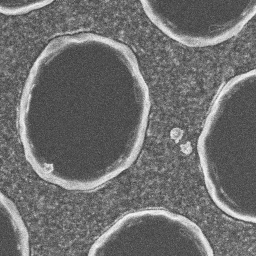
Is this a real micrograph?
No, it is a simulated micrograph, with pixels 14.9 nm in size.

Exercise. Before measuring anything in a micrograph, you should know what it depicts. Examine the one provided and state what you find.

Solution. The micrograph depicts raised bodies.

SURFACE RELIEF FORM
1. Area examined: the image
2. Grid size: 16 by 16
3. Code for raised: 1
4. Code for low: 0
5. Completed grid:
1100000001111111
0000000000111110
0000010000011000
0001111100000000
0011111110000000
0011111110000011
0111111110000011
0111111110000111
0111111110000111
0011111100000111
0011111100000111
0000110000000111
0000000000000011
1000000011100001
1000000111110000
1100001111111000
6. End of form